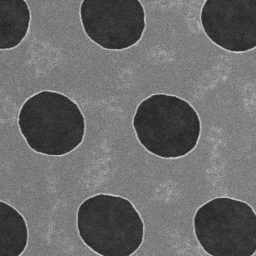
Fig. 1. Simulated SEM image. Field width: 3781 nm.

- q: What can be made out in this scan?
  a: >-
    holes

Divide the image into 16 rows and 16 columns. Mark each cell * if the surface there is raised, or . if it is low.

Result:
..***....****...
..***....****...
.*****...****...
****************
****************
****************
**...****...****
*....***....****
*....****...****
***.*****...****
****************
****************
*****...*****..*
.****....***....
..***....***....
..****...****...